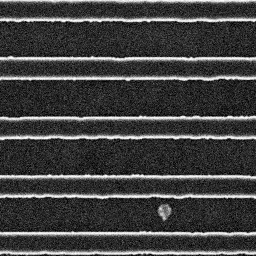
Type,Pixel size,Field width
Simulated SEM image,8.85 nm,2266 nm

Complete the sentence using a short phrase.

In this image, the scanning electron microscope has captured lines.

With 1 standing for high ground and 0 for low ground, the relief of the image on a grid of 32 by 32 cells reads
11111111111111111111111111111111
11111111111111111111111111111111
11111111111111111111111111111111
00000000000000000000000000000000
00000000000000000000000000000000
00000000000000000000000000000000
00000000000000000000000000000000
11111111111111111111111111111111
11111111111111111111111111111111
11111111111111111111111111111111
00000000000000000000000000000000
00000000000000000000000000000000
00000000000000000000000000000000
00000000000000000000000000000000
00000000000000000000000000000000
11111111111111111111111111111111
11111111111111111111111111111111
00000000000000000000000000000000
00000000000000000000000000000000
00000000000000000000000000000000
00000000000000000000000000000000
00000000000000000000000000000000
11111111111111111111111111111111
11111111111111111111111111111111
11111111111111111111111111111111
00000000000000000000000000000000
00000000000000000000000000000000
00000000000000000000000000000000
00000000000000000000000000000000
11111111111111111111111111111111
11111111111111111111111111111111
11111111111111111111111111111111